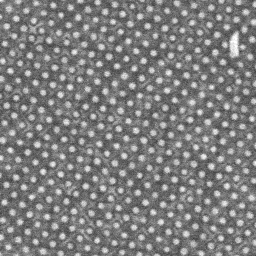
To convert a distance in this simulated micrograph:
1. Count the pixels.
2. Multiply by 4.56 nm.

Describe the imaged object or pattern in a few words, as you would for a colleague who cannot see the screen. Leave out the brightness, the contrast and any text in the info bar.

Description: a regular array of raised bodies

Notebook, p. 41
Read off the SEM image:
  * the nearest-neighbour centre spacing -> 55.7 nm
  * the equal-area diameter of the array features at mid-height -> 25.2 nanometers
